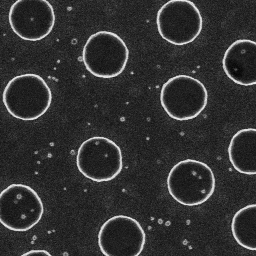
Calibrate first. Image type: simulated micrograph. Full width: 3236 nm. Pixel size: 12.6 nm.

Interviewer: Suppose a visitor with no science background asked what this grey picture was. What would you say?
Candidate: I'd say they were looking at raised bodies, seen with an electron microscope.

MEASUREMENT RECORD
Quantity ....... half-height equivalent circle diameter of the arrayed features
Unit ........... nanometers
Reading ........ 558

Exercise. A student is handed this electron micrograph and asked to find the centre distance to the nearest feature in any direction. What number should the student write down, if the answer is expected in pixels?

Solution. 88.9